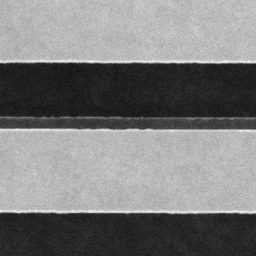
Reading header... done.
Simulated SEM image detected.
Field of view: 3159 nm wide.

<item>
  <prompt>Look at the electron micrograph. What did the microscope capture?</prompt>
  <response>lines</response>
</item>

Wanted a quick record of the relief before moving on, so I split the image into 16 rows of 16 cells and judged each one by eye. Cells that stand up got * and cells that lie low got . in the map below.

****************
****************
****************
****************
................
................
................
****************
****************
****************
****************
****************
****************
................
................
................